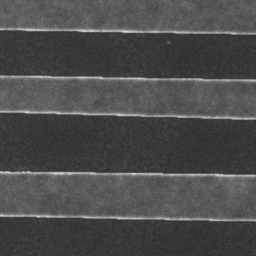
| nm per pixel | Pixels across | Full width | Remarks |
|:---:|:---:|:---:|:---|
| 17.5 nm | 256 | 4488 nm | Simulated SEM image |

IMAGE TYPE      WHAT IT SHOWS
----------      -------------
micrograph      lines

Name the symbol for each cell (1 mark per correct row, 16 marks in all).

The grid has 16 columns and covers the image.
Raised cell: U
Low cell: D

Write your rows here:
UUUUUUUUUUUUUUUU
UUUUUUUUUUUUUUUU
DDDDDDDDDDDDDDDD
DDDDDDDDDDDDDDDD
DDDDDDDDDDDDDDDD
UUUUUUUUUUUUUUUU
UUUUUUUUUUUUUUUU
DDDDDDDDDDDDDDDD
DDDDDDDDDDDDDDDD
DDDDDDDDDDDDDDDD
DDDDDDDDDDDDDDDD
UUUUUUUUUUUUUUUU
UUUUUUUUUUUUUUUU
UUUUUUUUUUUUUUUU
DDDDDDDDDDDDDDDD
DDDDDDDDDDDDDDDD